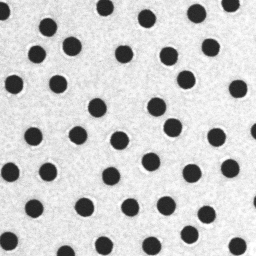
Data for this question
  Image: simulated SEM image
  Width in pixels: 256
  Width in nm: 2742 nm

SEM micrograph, a regular array of holes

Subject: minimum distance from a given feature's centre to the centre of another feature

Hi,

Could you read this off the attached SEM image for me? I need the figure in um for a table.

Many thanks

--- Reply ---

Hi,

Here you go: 0.393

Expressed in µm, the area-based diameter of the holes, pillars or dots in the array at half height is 0.205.